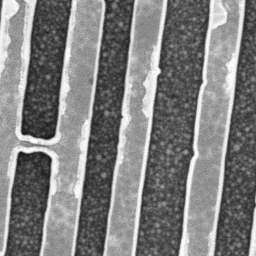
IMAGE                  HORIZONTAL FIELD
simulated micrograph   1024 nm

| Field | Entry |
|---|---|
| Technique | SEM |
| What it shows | one or a few lines or trenches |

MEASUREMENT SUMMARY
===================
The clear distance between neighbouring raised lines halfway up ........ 150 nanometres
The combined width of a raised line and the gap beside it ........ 278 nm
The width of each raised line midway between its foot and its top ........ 125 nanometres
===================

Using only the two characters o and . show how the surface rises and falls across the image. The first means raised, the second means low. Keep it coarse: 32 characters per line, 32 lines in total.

oooo.....oooo....oooo.....oooo..
oooo.....oooo....oooo.....oooo..
oooo.....oooo....ooo......oooo..
oooo.....oooo....ooo......oooo..
oooo.....oooo...oooo......oooo..
oooo....oooo....oooo......oooo..
oooo....oooo....oooo......oooo..
ooo.....oooo....oooo......ooo...
ooo.....oooo....oooo......ooo...
ooo.....oooo....ooo.......ooo...
ooo.....oooo....ooo......oooo...
ooo.....oooo....ooo......oooo...
ooo.....oooo....ooo......oooo...
ooo....oooo....oooo......oooo...
ooo....oooo....oooo......oooo...
oo.....oooo....oooo......oooo...
oo.....oooo....oooo......ooo....
ooooo.ooooo....oooo.....oooo....
ooooooooooo....ooo......oooo....
oo....ooooo....ooo......oooo....
oo.....oooo....ooo......oooo....
oo.....ooo....oooo......oooo....
oo....oooo....oooo......oooo....
o.....oooo....oooo......oooo....
o.....oooo....oooo.....oooo.....
o.....oooo....ooo......oooo.....
o.....oooo....ooo......oooo.....
o.....oooo....ooo......oooo.....
o.....oooo...oooo......oooo.....
o.....ooo....oooo......oooo.....
o....oooo....oooo......oooo....o
o....oooo....oooo......oooo....o